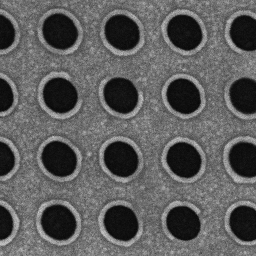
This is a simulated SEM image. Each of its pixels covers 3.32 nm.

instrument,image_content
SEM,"a regular array of holes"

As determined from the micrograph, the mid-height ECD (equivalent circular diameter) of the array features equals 115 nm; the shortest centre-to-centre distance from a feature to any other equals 207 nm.